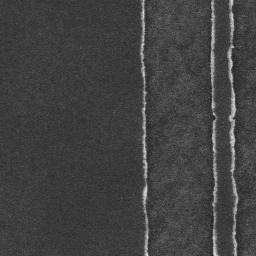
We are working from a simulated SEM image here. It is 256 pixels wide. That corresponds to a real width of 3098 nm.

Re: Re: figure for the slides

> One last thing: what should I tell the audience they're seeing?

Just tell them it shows one or a few lines or trenches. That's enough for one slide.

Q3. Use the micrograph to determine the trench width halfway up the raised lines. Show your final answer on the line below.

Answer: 820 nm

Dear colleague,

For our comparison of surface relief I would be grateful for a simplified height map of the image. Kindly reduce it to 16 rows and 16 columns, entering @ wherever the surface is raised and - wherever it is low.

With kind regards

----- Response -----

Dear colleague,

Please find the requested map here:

@@@@@@@@@----@--
@@@@@@@@@----@@-
@@@@@@@@@----@@-
@@@@@@@@@----@--
@@@@@@@@@----@--
@@@@@@@@@----@@-
@@@@@@@@@----@@-
@@@@@@@@@----@@-
@@@@@@@@@----@@-
@@@@@@@@@----@@-
@@@@@@@@@----@@-
@@@@@@@@@----@@-
@@@@@@@@@----@@-
@@@@@@@@@----@@-
@@@@@@@@@----@@-
@@@@@@@@@----@@-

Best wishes